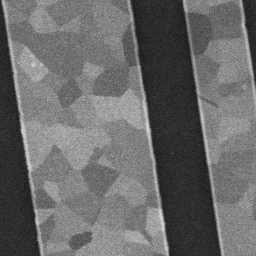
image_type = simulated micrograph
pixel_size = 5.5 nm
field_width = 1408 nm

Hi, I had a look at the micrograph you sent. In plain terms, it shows one or a few lines or trenches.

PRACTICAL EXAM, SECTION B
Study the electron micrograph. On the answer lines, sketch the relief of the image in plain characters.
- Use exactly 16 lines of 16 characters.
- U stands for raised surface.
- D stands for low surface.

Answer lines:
UUUUUUUUDDDDUUUD
UUUUUUUUDDDDUUUD
DUUUUUUUDDDDUUUD
DUUUUUUUUDDDUUUU
DUUUUUUUUDDDUUUU
DUUUUUUUUDDDUUUU
DUUUUUUUUDDDDUUU
DUUUUUUUUDDDDUUU
DUUUUUUUUDDDDUUU
DDUUUUUUUUDDDUUU
DDUUUUUUUUDDDUUU
DDUUUUUUUUDDDUUU
DDUUUUUUUUDDDUUU
DDUUUUUUUUDDDDUU
DDUUUUUUUUDDDDUU
DDDUUUUUUUDDDDUU